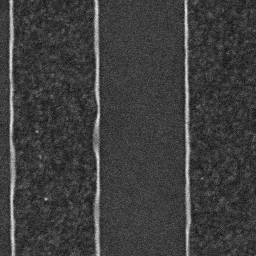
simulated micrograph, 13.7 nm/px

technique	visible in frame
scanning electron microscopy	wiring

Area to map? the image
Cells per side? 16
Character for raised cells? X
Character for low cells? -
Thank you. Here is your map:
-XXXXX------XXXX
-XXXXX------XXXX
-XXXXX------XXXX
-XXXXX------XXXX
-XXXXX------XXXX
-XXXXX------XXXX
-XXXXX------XXXX
-XXXXX------XXXX
-XXXXX------XXXX
-XXXXX------XXXX
-XXXXX------XXXX
-XXXXX------XXXX
-XXXXX------XXXX
-XXXXX------XXXX
-XXXXX------XXXX
-XXXXX------XXXX